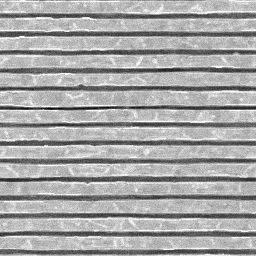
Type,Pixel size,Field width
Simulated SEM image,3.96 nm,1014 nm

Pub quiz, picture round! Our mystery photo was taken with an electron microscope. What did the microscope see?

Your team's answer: parallel lines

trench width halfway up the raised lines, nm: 19.3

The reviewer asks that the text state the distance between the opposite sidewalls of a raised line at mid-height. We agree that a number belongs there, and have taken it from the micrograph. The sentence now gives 12.8 pixels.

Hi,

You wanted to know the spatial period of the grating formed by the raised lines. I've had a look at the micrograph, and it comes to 72 nanometres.